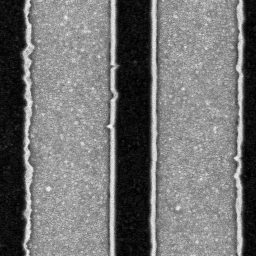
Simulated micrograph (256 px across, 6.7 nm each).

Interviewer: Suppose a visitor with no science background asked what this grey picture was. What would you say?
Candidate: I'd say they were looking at one or a few lines or trenches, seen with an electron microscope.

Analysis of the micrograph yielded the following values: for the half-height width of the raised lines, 279 nanometers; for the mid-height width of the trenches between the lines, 571 nanometers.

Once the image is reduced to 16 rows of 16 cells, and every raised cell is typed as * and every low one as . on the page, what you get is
**.....***.....*
**.....***.....*
**.....***.....*
**.....***.....*
**.....***.....*
**.....***.....*
**.....***.....*
**.....***.....*
**.....***.....*
**.....***.....*
**.....***.....*
**.....***.....*
**.....***.....*
**.....***.....*
**.....***.....*
**.....***.....*